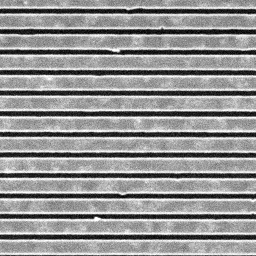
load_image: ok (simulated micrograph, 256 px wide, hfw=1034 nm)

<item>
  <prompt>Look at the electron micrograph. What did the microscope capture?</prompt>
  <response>parallel lines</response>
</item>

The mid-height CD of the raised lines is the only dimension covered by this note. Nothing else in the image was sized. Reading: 0.0555 µm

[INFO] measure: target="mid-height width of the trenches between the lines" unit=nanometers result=24.2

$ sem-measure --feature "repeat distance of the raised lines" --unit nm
82.8